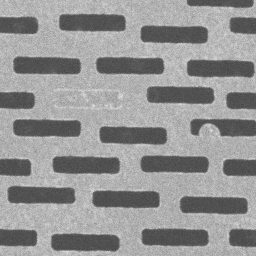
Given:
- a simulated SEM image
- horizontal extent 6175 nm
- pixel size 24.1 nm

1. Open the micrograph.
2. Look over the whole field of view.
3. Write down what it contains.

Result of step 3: a regular array of holes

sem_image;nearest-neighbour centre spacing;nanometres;1260